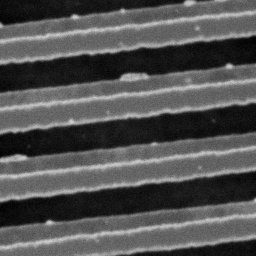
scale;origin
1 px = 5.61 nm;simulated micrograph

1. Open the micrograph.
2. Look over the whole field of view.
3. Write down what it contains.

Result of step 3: lines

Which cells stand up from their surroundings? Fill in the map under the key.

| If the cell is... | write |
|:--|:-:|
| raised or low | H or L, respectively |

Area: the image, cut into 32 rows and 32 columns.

LLLLLLLLLLLLLLLLLLLLLLLHHHHHHHHH
LLLLLLLLLLLLLLLHHHHHHHHHHHHHHHHH
LLLLLLHHHHHHHHHHHHHHHHHHHHHHHHHH
HHHHHHHHHHHHHHHHHHHHHHHHHHHHHHHH
HHHHHHHHHHHHHHHHHHHHHHHHHHHHHHHL
HHHHHHHHHHHHHHHHHHHHHHLLLLLLLLLL
HHHHHHHHHHHHHHHLLLLLLLLLLLLLLLLL
HHHHHLLLLLLLLLLLLLLLLLLLLLLLLLLL
LLLLLLLLLLLLLLLLLLLLLLLLLLLLHHHH
LLLLLLLLLLLLLLLHHHHHHHHHHHHHHHHH
LLLLLLLLLLHHHHHHHHHHHHHHHHHHHHHH
LLHHHHHHHHHHHHHHHHHHHHHHHHHHHHHH
HHHHHHHHHHHHHHHHHHHHHHHHHHHHHHHH
HHHHHHHHHHHHHHHHHHHHHHHHHHHLLLLL
HHHHHHHHHHHHHHHHHHHLLLLLLLLLLLLL
HHHHHHHHHHLLLLLLLLLLLLLLLLLLLLLL
HLLLLLLLLLLLLLLLLLLLLLLLLLLLLLLL
LLLLLLLLLLLLLLLLLLLLLLLLLHHHHHHH
LLLLLLLLLLLLLLLHHHHHHHHHHHHHHHHH
LHHLLHHHHHHHHHHHHHHHHHHHHHHHHHHH
HHHHHHHHHHHHHHHHHHHHHHHHHHHHHHHH
HHHHHHHHHHHHHHHHHHHHHHHHHHHHHHLL
HHHHHHHHHHHHHHHHHHHHHHHLLLLLLLLL
HHHHHHHHHHHHHLLLLLLLLLLLLLLLLLLL
HHHHHHHLLLLLLLLLLLLLLLLLLLLLLLLL
LLLLLLLLLLLLLLLLLLLLLLLLLLLLLHHH
LLLLLLLLLLLLLLLLLLLHHHHHHHHHHHHH
LLLLLLLLLLHHHHHHHHHHHHHHHHHHHHHH
HHHHHHHHHHHHHHHHHHHHHHHHHHHHHHHH
HHHHHHHHHHHHHHHHHHHHHHHHHHHHHHHH
HHHHHHHHHHHHHHHHHHHHHHHHHHHLLLLL
HHHHHHHHHHHHHHHHHHLLLLLLLLLLLLLL